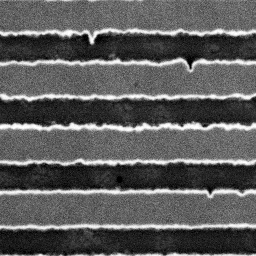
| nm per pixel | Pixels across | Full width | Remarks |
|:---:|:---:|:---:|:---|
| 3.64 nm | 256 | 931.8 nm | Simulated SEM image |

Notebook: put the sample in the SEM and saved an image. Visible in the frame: one or a few lines or trenches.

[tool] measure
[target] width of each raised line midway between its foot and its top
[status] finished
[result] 132 nanometers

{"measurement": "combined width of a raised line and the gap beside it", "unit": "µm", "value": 0.236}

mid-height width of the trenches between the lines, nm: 103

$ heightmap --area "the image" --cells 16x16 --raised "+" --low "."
++++++++++++++++
++++++++++++++++
................
................
++++++++++++++++
++++++++++++++++
................
................
++++++++++++++++
++++++++++++++++
................
................
++++++++++++++++
++++++++++++++++
................
................